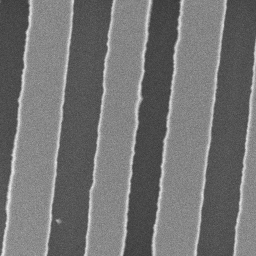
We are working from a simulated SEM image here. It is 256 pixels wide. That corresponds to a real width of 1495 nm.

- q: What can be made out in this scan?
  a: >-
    lines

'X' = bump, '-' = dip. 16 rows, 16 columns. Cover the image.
--XXX--XX--XXX--
--XX---XX--XXX--
--XX---XX--XXX--
--XX---XX--XXX--
-XXX---XX--XXX--
-XXX--XXX--XX---
-XXX--XXX--XX---
-XXX--XXX-XXX---
-XXX--XX--XXX--X
-XXX--XX--XXX--X
-XXX--XX--XXX--X
-XX---XX--XXX--X
XXX---XX--XXX--X
XXX---XX--XXX--X
XXX--XXX--XX---X
XXX--XXX--XX---X